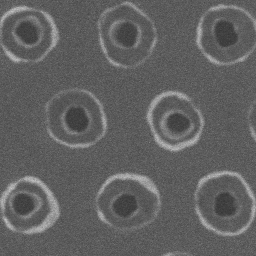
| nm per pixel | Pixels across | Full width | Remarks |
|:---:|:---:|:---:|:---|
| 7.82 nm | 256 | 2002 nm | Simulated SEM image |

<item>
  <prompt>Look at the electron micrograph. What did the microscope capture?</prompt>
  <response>ring-shaped raised bodies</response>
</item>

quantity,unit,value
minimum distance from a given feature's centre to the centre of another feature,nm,755